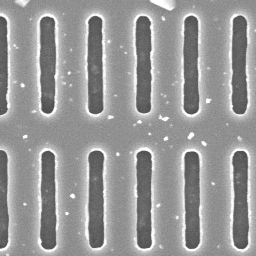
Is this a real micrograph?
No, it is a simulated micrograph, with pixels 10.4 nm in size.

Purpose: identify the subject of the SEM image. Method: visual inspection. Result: a regular array of holes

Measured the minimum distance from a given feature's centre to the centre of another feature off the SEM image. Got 500 nm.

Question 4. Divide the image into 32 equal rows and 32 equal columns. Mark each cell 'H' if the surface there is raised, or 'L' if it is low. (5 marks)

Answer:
HHHHHHHHHHHHHHHHHHHHHHHHHHHHHHHH
HHHHHHHHHHHHHHHHHHHHHHHHHHHHHHHH
LHHHHLLHHHHLLHHHHLLHHHHLLHHHHLLH
LHHHHLLHHHHLLHHHHLLHHHHLLHHHHLLH
LHHHHLLHHHHLLHHHHLLHHHHLLHHHHLLH
LHHHHLLHHHHLLHHHHLLHHHHLLHHHHLLH
LHHHHLLHHHHLLHHHHLLHHHHLLHHHHLLH
LHHHHLLHHHHLLHHHHLLHHHHLLHHHHLLH
LHHHHLLHHHHLLHHHHLLHHHHLLHHHHLLH
LHHHHLLHHHHLLHHHHLLHHHHLLHHHHLLH
LHHHHLLHHHHLLHHHHLLHHHHLLHHHHLLH
LHHHHLLHHHHLLHHHHLLHHHHLLHHHHLLH
LHHHHLLHHHHLLHHHHLLHHHHLLHHHHLLH
LHHHHLLHHHHLLHHHHLLHHHHLLHHHHLLH
HHHHHHHHHHHHHHHHHHHHHHHHHHHHHHHH
HHHHHHHHHHHHHHHHHHHHHHHHHHHHHHHH
HHHHHHHHHHHHHHHHHHHHHHHHHHHHHHHH
HHHHHHHHHHHHHHHHHHHHHHHHHHHHHHHH
HHHHHHHHHHHHHHHHHHHHHHHHHHHHHHHH
LHHHHLLHHHHLLHHHHLLHHHHLLHHHHLLH
LHHHHLLHHHHLLHHHHLLHHHHLLHHHHLLH
LHHHHLLHHHHLLHHHHLLHHHHLLHHHHLLH
LHHHHLLHHHHLLHHHHLLHHHHLLHHHHLLH
LHHHHLLHHHHLLHHHHLLHHHHLLHHHHLLH
LHHHHLLHHHHLLHHHHLLHHHHLLHHHHLLH
LHHHHLLHHHHLLHHHHLLHHHHLLHHHHLLH
LHHHHLLHHHHLLHHHHLLHHHHLLHHHHLLH
LHHHHLLHHHHLLHHHHLLHHHHLLHHHHLLH
LHHHHLLHHHHLLHHHHLLHHHHLLHHHHLLH
LHHHHLLHHHHLLHHHHLLHHHHLLHHHHLLH
LHHHHLLHHHHLLHHHHLLHHHHLLHHHHLLH
HHHHHHHHHHHHHHHHHHHHHHHHHHHHHHHH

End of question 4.